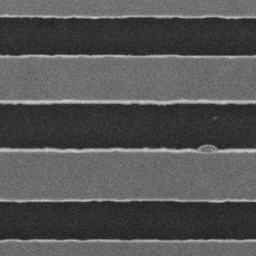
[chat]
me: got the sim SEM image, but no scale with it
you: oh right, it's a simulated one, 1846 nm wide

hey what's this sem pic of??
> lines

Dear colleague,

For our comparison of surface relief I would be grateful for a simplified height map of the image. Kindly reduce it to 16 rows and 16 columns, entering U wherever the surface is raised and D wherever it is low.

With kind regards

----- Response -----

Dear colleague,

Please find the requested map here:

UUUUUUUUUUUUUUUU
DDDDDDDDDDDDDDDD
DDDDDDDDDDDDDDDD
DUUUUUUUDUUUDDDD
UUUUUUUUUUUUUUUU
UUUUUUUUUUUUUUUU
DDDDDDDDDDDDDDDD
DDDDDDDDDDDDDDDD
DDDDDDDDDDDDDDDD
UUUUUUUUUUUUUUUU
UUUUUUUUUUUUUUUU
UUUUUUUUUUUUUUUU
UUUUUUUUUUUUUUUU
DDDDDDDDDDDDDDDD
DDDDDDDDDDDDDDDD
UUUUUUUUUUUUUUUU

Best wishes